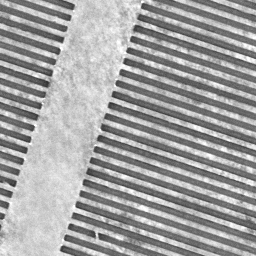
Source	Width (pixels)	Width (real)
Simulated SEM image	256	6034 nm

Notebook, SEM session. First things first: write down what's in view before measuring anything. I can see parallel lines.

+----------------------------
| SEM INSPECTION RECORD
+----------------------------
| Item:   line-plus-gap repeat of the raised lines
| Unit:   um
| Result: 0.274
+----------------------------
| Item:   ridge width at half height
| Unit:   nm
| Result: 117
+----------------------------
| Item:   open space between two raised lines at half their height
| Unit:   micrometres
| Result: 0.165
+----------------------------